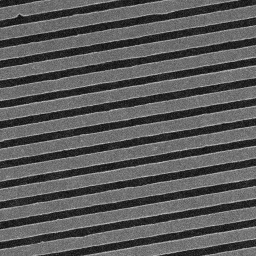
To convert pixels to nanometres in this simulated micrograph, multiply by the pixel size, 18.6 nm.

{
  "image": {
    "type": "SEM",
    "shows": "parallel lines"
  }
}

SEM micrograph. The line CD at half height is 225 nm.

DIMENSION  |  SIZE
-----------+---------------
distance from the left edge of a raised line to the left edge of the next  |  370 nm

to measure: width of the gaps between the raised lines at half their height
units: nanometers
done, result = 142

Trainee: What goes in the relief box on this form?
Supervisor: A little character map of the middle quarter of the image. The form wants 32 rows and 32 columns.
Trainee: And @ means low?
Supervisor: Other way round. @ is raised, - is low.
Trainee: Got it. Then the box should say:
@@@@@-------------@@@@@@@@@@@@@@
------------@@@@@@@@@@@@@@@@@---
------@@@@@@@@@@@@@@@@@---------
-@@@@@@@@@@@@@@@@-------------@@
@@@@@@@@@@@@------------@@@@@@@@
@@@@@-------------@@@@@@@@@@@@@@
------------@@@@@@@@@@@@@@@@@---
------@@@@@@@@@@@@@@@@@---------
-@@@@@@@@@@@@@@@@-------------@@
@@@@@@@@@@@-------------@@@@@@@@
@@@@@-------------@@@@@@@@@@@@@@
------------@@@@@@@@@@@@@@@@@@--
------@@@@@@@@@@@@@@@@@---------
@@@@@@@@@@@@@@@@@@-------------@
@@@@@@@@@@@@------------@@@@@@@@
@@@@@-------------@@@@@@@@@@@@@@
------------@@@@@@@@@@@@@@@@@@--
-------@@@@@@@@@@@@@@@@@--------
@@@@@@@@@@@@@@@@@@-------------@
@@@@@@@@@@@@-------------@@@@@@@
@@@@@@------------@@@@@@@@@@@@@@
------------@@@@@@@@@@@@@@@@@@--
-------@@@@@@@@@@@@@@@@@--------
-@@@@@@@@@@@@@@@@@-------------@
@@@@@@@@@@@@-------------@@@@@@@
@@@@@@-------------@@@@@@@@@@@@@
-------------@@@@@@@@@@@@@@@@@--
-------@@@@@@@@@@@@@@@@@--------
-@@@@@@@@@@@@@@@@@--------------
@@@@@@@@@@@@-------------@@@@@@@
@@@@@@--------------@@@@@@@@@@@@
-------------@@@@@@@@@@@@@@@@@--